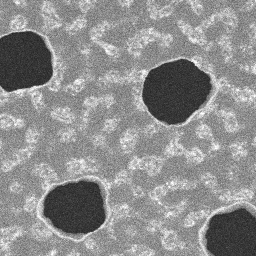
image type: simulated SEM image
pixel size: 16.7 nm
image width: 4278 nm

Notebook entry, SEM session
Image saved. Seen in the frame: holes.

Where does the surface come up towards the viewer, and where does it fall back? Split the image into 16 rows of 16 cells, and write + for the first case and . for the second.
++++++++++++++++
++++++++++++++++
...+++++++++++++
...+++++++++++++
...++++++....+++
..+++++++....+++
+++++++++....+++
++++++++++..++++
++++++++++++++++
++++++++++++++++
++++++++++++++++
++++..++++++++++
+++....+++++++++
+++....++++++...
++++..+++++++...
+++++++++++++...